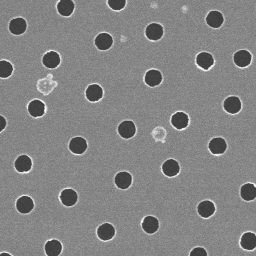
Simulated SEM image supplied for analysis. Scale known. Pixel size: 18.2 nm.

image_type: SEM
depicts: a regular array of holes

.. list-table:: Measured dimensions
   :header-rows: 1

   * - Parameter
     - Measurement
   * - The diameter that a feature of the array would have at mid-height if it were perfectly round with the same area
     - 318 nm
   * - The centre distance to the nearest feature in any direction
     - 46.2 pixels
